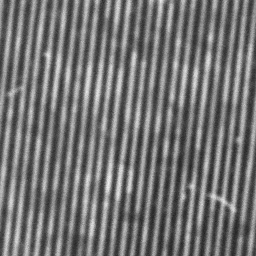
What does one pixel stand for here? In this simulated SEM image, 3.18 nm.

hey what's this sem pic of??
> parallel lines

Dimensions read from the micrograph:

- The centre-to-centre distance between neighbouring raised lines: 0.0335 um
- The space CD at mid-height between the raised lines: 24 nanometers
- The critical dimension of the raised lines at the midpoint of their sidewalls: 8.7 nanometers